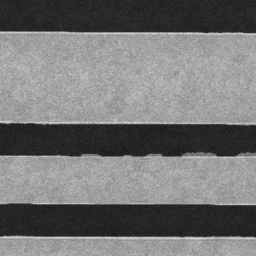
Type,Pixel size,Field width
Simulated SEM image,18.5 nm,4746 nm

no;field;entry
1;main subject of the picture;lines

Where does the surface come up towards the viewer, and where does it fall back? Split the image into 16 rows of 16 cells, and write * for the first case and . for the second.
................
................
****************
****************
****************
****************
****************
****************
................
................
****************
****************
****************
................
................
****************